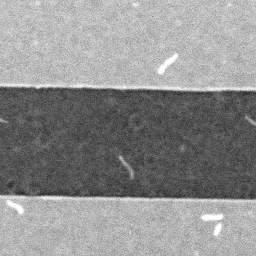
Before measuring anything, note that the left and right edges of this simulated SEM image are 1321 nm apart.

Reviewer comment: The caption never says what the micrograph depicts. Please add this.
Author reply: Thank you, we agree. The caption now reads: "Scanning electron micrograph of one or a few lines or trenches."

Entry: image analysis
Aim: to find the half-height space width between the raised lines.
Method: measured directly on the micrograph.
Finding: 571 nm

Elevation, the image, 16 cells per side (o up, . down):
oooooooooooooooo
oooooooooooooooo
oooooooooooooooo
oooooooooooooooo
oooooooooooooooo
.......o..oooooo
................
................
................
................
................
................
oooooooooooo.oo.
oooooooooooooooo
oooooooooooooooo
oooooooooooooooo